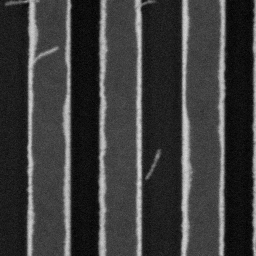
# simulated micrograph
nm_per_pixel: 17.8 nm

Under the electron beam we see lines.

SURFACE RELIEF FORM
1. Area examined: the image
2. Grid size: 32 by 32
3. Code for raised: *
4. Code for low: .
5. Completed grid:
....*****....*****.....*****....
....*****....*****.....*****....
....*****....*****.....*****....
....*****....*****.....*****....
....*****....*****.....*****....
....*****....*****.....*****....
....*****....*****.....*****....
....*****....*****.....*****....
....*****....*****.....*****....
....*****....*****.....*****....
....*****....*****.....*****....
....*****....*****.....*****....
....*****....*****.....*****....
....*****....*****.....*****....
....*****....*****.....*****....
....*****....*****.....*****....
....*****....*****.....*****....
....*****....*****.....*****....
....*****....*****.....*****....
....*****....*****.....*****....
....*****....*****.....*****....
....*****....*****.....*****....
....*****....*****.....*****....
....*****....*****.....*****....
....*****....*****.....*****....
....*****....*****.....*****....
....*****....*****.....*****....
....*****....*****.....*****....
....*****....*****.....*****....
....*****....*****.....*****....
....*****....*****.....*****....
....*****....*****.....*****....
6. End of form